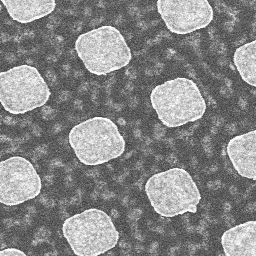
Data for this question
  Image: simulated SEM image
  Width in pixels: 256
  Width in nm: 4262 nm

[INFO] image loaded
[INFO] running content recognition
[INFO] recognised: raised bodies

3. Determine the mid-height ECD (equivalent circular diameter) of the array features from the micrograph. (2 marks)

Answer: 0.821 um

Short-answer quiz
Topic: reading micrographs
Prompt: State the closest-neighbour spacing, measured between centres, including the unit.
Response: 1500 nm